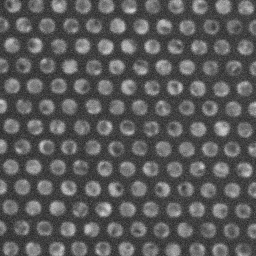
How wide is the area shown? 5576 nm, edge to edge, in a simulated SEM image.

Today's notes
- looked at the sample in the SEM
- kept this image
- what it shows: a regular array of raised bodies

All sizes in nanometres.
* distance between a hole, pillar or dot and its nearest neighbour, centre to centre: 495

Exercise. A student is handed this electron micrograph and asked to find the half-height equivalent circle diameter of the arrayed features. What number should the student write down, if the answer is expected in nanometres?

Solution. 286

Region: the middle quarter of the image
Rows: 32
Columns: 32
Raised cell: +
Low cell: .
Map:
+++...+++...+++...+++..+++...+++
+++...+++...+++...+++..+++...+++
................................
................................
...+++...++....++..........+....
...+++...+++...+++..+++...+++...
...+++...+++...+++...++...+++...
................................
................................
++....++....++....++..........+.
+++...+++...+++..+++...+++...+++
+++...+++...+++..+++...+++...+++
................................
................................
....+....++....+................
...+++...+++..+++...+++...+++...
...+++...+++..+++...+++...+++...
.....................++....++...
................................
.+.....+..........+.............
+++...+++...+++..+++...+++...+++
+++...+++...+++...++...+++...+++
............++..........++....++
................................
...++...........................
...+++...+++..+++...+++...+++...
...+++...+++..+++...+++...+++...
.........++....++....++....++...
................................
................................
+++...+++...++...+++...+++...+++
+++...+++..+++...+++...+++...+++